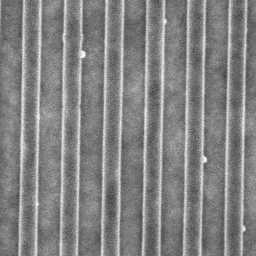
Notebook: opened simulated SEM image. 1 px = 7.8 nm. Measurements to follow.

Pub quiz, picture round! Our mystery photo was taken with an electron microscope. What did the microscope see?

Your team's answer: parallel lines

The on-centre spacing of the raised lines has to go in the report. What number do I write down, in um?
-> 0.321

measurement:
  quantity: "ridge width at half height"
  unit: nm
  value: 138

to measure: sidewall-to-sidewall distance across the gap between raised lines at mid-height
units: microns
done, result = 0.181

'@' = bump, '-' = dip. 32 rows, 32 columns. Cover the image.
---@@---@@---@@---@@@---@@---@@-
---@@---@@---@@---@@@---@@---@@-
---@@---@@---@@---@@@--@@@---@@-
---@@---@@---@@---@@---@@@---@@-
---@@---@@---@@---@@---@@@---@@-
---@@---@@---@@---@@---@@@---@@-
---@@---@@---@@---@@---@@@---@@-
---@@---@@---@@---@@---@@----@@-
---@@---@@---@@---@@---@@----@@-
---@@---@@---@@---@@---@@----@@-
---@@---@@---@@---@@---@@----@@-
---@@---@@---@@---@@---@@----@@-
---@@---@@---@@---@@---@@---@@@-
---@@---@@---@@---@@---@@---@@--
---@@---@@---@@---@@---@@---@@--
---@@---@@---@@---@@---@@---@@--
---@@---@@---@@---@@---@@---@@--
---@@---@@---@@---@@---@@---@@--
---@@---@@---@@---@@---@@---@@--
---@@---@@---@@---@@---@@@--@@--
---@@---@@---@@---@@---@@---@@--
---@@---@@---@@---@@---@@---@@--
---@@---@@---@@---@@---@@---@@--
---@@---@@---@@---@@---@@---@@--
---@@---@@---@@---@@---@@---@@--
---@@---@@---@@---@@---@@---@@--
---@@---@@---@@---@@---@@---@@--
---@@---@@---@@---@@---@@---@@--
--@@@---@@---@@---@@---@@---@@--
--@@@---@@---@@---@@---@@---@@--
--@@@---@@---@@---@@---@@---@@--
--@@@---@@---@@---@@---@@---@@--